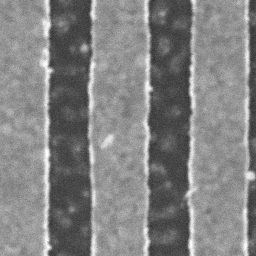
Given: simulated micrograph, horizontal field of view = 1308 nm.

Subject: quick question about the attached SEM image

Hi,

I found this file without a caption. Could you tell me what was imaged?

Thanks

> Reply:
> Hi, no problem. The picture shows one or a few lines or trenches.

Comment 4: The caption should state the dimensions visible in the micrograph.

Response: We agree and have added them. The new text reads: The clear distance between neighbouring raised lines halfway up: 0.221 µm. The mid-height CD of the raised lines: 0.288 micrometres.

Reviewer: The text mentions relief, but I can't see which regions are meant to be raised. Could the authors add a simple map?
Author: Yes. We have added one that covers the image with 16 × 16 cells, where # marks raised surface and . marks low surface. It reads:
###...###...###.
###...###...###.
###...###...####
###...###...####
###...###...####
###...###...####
###...###...###.
###...###...###.
###...###...###.
###...###...###.
###...###...####
###...###...###.
###...###...###.
###...###...###.
###...###...###.
###...###...###.